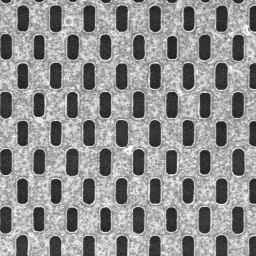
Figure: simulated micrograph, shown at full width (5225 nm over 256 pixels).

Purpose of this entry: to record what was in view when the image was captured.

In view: a regular array of holes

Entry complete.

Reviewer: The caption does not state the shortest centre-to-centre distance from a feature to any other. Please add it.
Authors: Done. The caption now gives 0.667 µm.